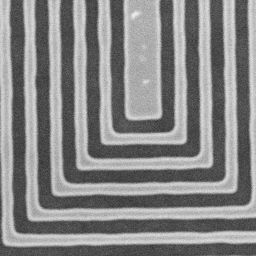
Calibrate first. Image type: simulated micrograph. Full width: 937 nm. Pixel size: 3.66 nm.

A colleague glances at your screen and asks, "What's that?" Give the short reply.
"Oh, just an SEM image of groups of lines, slits or small figures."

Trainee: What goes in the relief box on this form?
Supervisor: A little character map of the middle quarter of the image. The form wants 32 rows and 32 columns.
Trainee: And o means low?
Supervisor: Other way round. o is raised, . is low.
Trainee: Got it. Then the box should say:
...oo....oo....ooooooooo....oo..
...oo....oo....ooooooooo....oo..
...oo....oo....ooooooooo....oo..
...oo....oo....ooooooooo....oo..
...oo....oo....ooooooooo....oo..
...oo....oo....ooooooooo....oo..
...oo....oo....ooooooooo....oo..
...oo....oo....ooooooooo....oo..
...oo....oo....ooooooooo....oo..
...oo.....o....ooooooooo....oo..
...oo....oo....ooooooooo....oo..
...oo....ooo...ooooooooo....oo..
...oo....ooo...ooooooooo....oo..
...oo....ooo....oooooooo....oo..
...oo....ooo................oo..
...oo....ooo................oo..
...oo....ooo...............ooo..
...ooo...oooo...........oooooo..
...ooo....oooooooooooooooooooo..
...ooo....oooooooooooooooooooo..
...oo...........................
...oo...........................
...ooo..........................
...ooo..........................
...ooooooooooooooooooooooooooooo
...ooooooooooooooooooooooooooooo
................................
................................
................................
o...............................
oooooooooooooooooooooooooooooooo
oooooooooooooooooooooooooooooooo